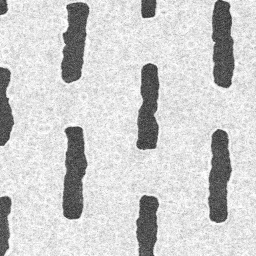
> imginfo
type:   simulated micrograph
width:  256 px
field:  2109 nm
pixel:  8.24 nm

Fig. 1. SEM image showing holes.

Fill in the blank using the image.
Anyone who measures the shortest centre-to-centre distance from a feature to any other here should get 810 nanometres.